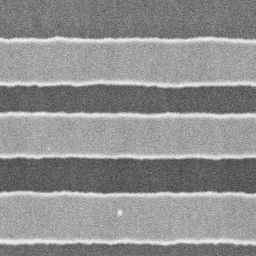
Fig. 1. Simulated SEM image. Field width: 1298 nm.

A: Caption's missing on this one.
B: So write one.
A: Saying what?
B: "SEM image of lines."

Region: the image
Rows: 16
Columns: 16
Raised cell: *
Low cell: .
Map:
................
................
**********.****.
****************
****************
................
................
****************
****************
****************
................
................
****************
****************
****************
................